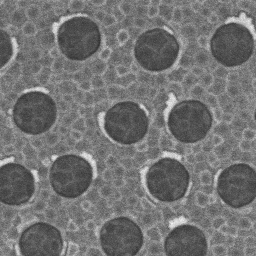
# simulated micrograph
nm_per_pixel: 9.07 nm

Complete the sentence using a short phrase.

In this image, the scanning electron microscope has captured a regular array of holes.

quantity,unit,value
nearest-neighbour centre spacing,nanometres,659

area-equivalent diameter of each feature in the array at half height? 0.402 micrometres